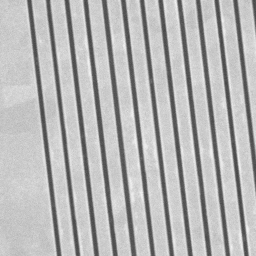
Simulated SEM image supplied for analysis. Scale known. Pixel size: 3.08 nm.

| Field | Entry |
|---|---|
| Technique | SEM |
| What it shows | parallel lines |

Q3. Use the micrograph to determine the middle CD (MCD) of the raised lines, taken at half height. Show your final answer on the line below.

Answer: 40.1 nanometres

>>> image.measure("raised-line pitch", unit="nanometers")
57.3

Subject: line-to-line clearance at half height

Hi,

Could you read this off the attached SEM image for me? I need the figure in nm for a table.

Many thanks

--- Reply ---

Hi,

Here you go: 16